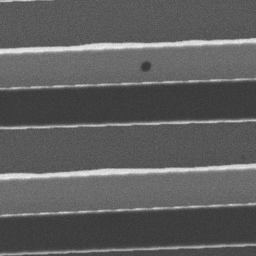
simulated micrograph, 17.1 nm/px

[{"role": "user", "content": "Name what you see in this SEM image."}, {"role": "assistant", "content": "lines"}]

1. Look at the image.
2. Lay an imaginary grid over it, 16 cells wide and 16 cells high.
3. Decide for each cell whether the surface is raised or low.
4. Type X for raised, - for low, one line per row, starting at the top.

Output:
----------------
----------------
----------------
XXXXXXXXXXXXXXXX
XXXXXXXXXXXXXXXX
XXXXXXXXXXXXXXXX
XXXXXXXXXXXXXXXX
XXXXXXXXXXXXXXXX
----------------
----------------
--------------XX
XXXXXXXXXXXXXXXX
XXXXXXXXXXXXXXXX
XXXXXXXXXXXXXXXX
XXXXXXXXXXXXXXXX
XXXXXXXXXXX-----